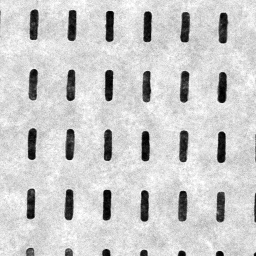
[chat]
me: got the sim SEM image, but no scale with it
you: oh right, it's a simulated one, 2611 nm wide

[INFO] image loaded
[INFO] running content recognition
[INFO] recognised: a regular array of holes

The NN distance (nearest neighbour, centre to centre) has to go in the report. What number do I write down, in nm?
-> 386